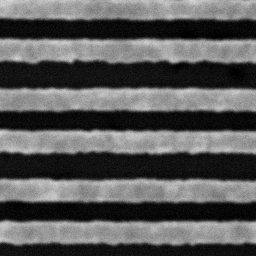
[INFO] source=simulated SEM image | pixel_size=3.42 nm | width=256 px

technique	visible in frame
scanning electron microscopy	lines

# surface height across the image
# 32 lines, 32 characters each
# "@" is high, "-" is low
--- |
@@@@@@@@@@@@@@@@@@@@@@@@@@@@@@@@
@@@@@@@@@@@@@@@@@@@@@@@@@@@@@@@@
--------------------------------
--------------------------------
--------------------------------
@@@@@@@@@@@@@@@@@@@@@@@@@@@@@@@@
@@@@@@@@@@@@@@@@@@@@@@@@@@@@@@@@
--@@@--@@-@--@@@@@-@-@@@@-@@@@@@
--------------------------------
--------------------------------
--------------------------------
@@@@@@@@@@@@@@@@@@@@@@@@@@@@@@@@
@@@@@@@@@@@@@@@@@@@@@@@@@@@@@@@@
@@@@@@@@@@@@@@@@@@@@@@@@@@@@@@@@
--------------------------------
--------------------------------
@@@--@@@-@--@@--@---@-------@---
@@@@@@@@@@@@@@@@@@@@@@@@@@@@@@@@
@@@@@@@@@@@@@@@@@@@@@@@@@@@@@@@@
--------------------------------
--------------------------------
--------------------------------
@---@@-----------@@-------------
@@@@@@@@@@@@@@@@@@@@@@@@@@@@@@@@
@@@@@@@@@@@@@@@@@@@@@@@@@@@@@@@@
--------------------------------
--------------------------------
--------------------------------
@@@@@@@@@@@@@@@@@@@@@@@@@@@@@@@@
@@@@@@@@@@@@@@@@@@@@@@@@@@@@@@@@
--@----------------@-@@---------
--------------------------------